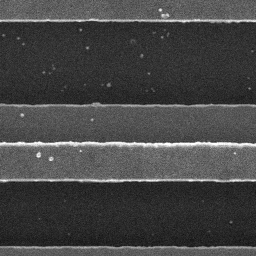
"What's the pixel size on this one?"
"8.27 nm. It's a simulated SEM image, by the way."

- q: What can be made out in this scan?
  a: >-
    lines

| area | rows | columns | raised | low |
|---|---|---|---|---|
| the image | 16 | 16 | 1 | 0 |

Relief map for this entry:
1111111111111111
0000000000000000
0000000000000000
0000000000000000
0000000000000000
0000000000000000
0000000000000000
1111111111111111
1111111111111111
1111111111111111
1111111111111111
0000000000000000
0000000000000000
0000000000000000
0000000000000000
1111111111111111